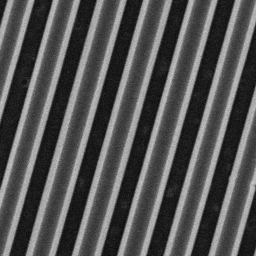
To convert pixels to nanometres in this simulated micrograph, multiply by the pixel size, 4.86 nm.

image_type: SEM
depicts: parallel lines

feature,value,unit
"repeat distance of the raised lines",213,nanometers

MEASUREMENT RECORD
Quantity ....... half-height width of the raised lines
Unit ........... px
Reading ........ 23.1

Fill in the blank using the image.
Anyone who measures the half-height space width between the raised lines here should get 99.5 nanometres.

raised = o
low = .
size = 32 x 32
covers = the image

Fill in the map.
.ooo...ooo..ooo...ooo...ooo...oo
.ooo..ooo...ooo...ooo..ooo...ooo
.oo...ooo...ooo..ooo...ooo...ooo
ooo...ooo..oooo..ooo...ooo...ooo
ooo...oo...ooo...ooo...ooo..ooo.
oo...ooo...ooo...ooo..ooo...ooo.
oo...ooo...ooo..ooo...ooo...ooo.
oo...ooo..ooo...ooo...ooo...oo..
oo...oo...ooo...ooo..ooo...ooo..
o...ooo...ooo...ooo..ooo...ooo..
o...ooo..oooo..ooo...ooo...oo...
o...ooo..ooo...ooo...ooo...oo...
...ooo...ooo...ooo..ooo...ooo...
...ooo...ooo..ooo...ooo...ooo...
...ooo..ooo...ooo...ooo...oo...o
...oo...ooo...ooo...ooo..ooo...o
..ooo...ooo...ooo..ooo...ooo...o
..ooo...ooo..ooo...ooo...ooo..oo
..ooo..ooo...ooo...ooo...oo...oo
.ooo...ooo...ooo..ooo...ooo...oo
.ooo...ooo..ooo...ooo...ooo...oo
.ooo...ooo..ooo...ooo...oo...ooo
.oo...ooo...ooo...ooo..ooo...ooo
ooo...ooo...ooo..ooo...ooo...ooo
ooo...ooo..ooo...ooo...ooo..ooo.
ooo..ooo...ooo...ooo...oo...ooo.
oo...ooo...ooo..oooo..ooo...ooo.
oo...ooo...oo...ooo...ooo...ooo.
oo..oooo..ooo...ooo...ooo..ooo..
oo..ooo...ooo...ooo..ooo...ooo..
o...ooo...ooo..ooo...ooo...ooo..
o...ooo..ooo...ooo...ooo..ooo...